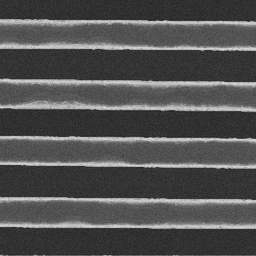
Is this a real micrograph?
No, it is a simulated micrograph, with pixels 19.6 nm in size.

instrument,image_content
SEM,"lines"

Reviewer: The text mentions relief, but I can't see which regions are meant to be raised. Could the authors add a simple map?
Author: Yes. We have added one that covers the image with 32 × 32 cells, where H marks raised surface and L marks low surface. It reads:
LLLLLLLLLLLLLLLLLLLLLLLLLLLLLLLL
LLLLLLLLLLLLLLLLLLLLLLLLLLLLLLLL
HHLLLHLLLLLLLLLLLLLLLLLLLLLLLLLL
HHHHHHHHHHHHHHHHHHHHHHHHHHHHHHHH
HHHHHHHHHHHHHHHHHHHHHHHHHHHHHHHH
HHHHHHHHHHHHHHHHHHHHHHHHHHHHHHHH
LLLLLLLLLLLLLLLLLLLLLLLLLLLLLLLL
LLLLLLLLLLLLLLLLLLLLLLLLLLLLLLLL
LLLLLLLLLLLLLLLLLLLLLLLLLLLLLLLL
LLLLLLLLLLLLLLLLLLLLLLLLLLLLLLLL
HHHHHHHHHHHHHHHHHHHHHHHHHHHHHHHH
HHHHHHHHHHHHHHHHHHHHHHHHHHHHHHHH
HHHHHHHHHHHHHHHHHHHHHHHHHHHHHHHH
LLHHLLHHHHHHHHHHHHHHHHHHHHHHHHHH
LLLLLLLLLLLLLLLLLLLLLLLLLLLLLLLL
LLLLLLLLLLLLLLLLLLLLLLLLLLLLLLLL
LLLLLLLLLLLLLLLLLLLLLLLLLLLLLLLL
HHHHHHHHHHHHHHHHHHHHHHHHHHHHHHHH
HHHHHHHHHHHHHHHHHHHHHHHHHHHHHHHH
HHHHHHHHHHHHHHHHHHHHHHHHHHHHHHHH
HHHHHHHHHHHHHHHHHHHHHHHHHHHHHHHH
LLLLLLLLLLLLLLLLLLLLLLLLLLLLLLLL
LLLLLLLLLLLLLLLLLLLLLLLLLLLLLLLL
LLLLLLLLLLLLLLLLLLLLLLLLLLLLLLLL
LLLLLLLLLLLLLLLLLLLLLLLLLLLLLLLL
HHHHHHHHHHHHHHHHHHHHHHHHHHHHHHHH
HHHHHHHHHHHHHHHHHHHHHHHHHHHHHHHH
HHHHHHHHHHHHHHHHHHHHHHHHHHHHHHHH
LLLLLLLLLLLLLLLLLLLHHLHHHHHHHHHH
LLLLLLLLLLLLLLLLLLLLLLLLLLLLLLLL
LLLLLLLLLLLLLLLLLLLLLLLLLLLLLLLL
LLLLLLLLLLLLLLLLLLLLLLLLLLLLLLLL